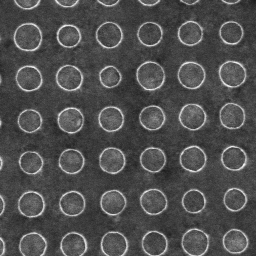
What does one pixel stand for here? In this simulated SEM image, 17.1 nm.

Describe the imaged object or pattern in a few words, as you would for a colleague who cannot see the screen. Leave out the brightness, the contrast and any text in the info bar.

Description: a regular array of holes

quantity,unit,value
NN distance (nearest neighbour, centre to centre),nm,693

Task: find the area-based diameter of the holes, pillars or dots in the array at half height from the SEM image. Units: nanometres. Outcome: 402